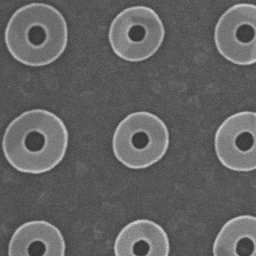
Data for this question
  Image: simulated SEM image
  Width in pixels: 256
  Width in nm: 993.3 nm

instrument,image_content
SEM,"ring-shaped raised bodies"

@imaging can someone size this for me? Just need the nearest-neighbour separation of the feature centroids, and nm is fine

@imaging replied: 398